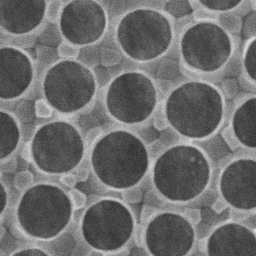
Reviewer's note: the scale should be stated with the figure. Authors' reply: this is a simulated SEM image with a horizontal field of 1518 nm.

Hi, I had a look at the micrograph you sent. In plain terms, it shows a regular array of holes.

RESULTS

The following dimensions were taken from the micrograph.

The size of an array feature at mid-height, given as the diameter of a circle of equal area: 311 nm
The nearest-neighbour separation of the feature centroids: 0.372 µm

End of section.